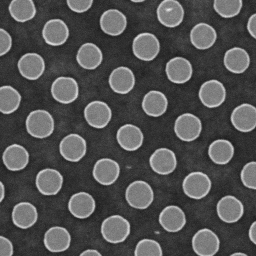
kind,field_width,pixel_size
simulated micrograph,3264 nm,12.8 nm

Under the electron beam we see a regular array of raised bodies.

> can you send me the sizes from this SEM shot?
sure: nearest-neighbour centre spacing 40.7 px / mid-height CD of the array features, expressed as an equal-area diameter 326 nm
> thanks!